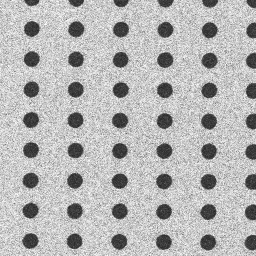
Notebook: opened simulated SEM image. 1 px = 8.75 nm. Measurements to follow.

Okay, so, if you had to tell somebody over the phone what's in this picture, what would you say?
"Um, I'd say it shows a regular array of holes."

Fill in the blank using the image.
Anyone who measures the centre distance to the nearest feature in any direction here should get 264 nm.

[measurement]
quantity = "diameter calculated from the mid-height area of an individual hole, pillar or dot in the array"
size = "135 nm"